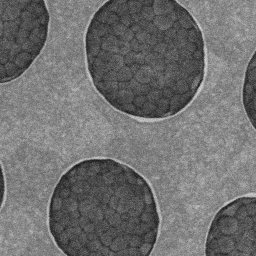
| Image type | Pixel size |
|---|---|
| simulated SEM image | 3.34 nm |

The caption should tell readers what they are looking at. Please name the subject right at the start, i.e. holes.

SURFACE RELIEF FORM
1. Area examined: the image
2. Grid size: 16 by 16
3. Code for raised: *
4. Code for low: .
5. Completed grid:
...***......****
...***......****
...**........***
..***........***
..****.......**.
******......***.
*******.....***.
****************
****************
****************
****....********
****.....*******
***.......*****.
***.......***...
***.......***...
****......***...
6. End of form